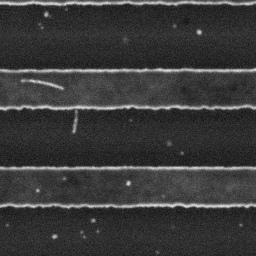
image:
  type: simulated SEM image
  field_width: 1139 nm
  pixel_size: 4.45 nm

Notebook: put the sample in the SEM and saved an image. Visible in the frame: lines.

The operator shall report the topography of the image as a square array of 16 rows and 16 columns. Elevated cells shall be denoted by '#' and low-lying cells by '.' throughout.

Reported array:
................
................
................
................
################
################
################
................
................
................
################
################
################
................
................
................